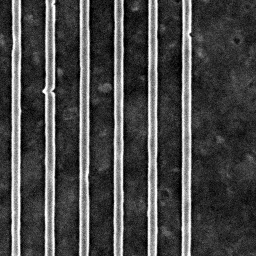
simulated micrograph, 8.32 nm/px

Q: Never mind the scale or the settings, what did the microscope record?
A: parallel lines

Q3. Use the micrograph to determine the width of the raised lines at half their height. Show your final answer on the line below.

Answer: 73.9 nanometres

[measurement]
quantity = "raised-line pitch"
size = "284 nm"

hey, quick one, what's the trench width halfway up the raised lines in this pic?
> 213 nanometres